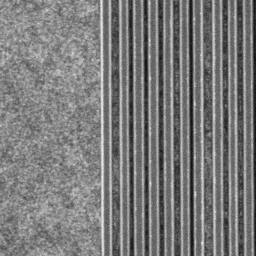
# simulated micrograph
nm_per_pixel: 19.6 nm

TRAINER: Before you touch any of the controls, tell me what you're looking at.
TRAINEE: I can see parallel lines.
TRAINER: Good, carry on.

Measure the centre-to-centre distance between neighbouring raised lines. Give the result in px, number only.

15.8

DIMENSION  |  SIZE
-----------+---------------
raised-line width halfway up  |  155 nm